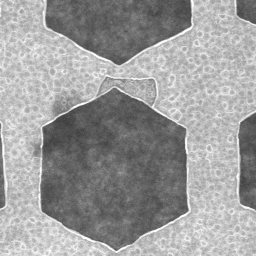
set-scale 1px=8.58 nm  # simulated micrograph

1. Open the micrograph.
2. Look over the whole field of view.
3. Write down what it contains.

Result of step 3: holes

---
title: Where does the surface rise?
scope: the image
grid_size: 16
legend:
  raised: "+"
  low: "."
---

+++.........+++.
+++.........++++
++++......++++++
++++++..++++++++
++++++++++++++++
++++++++++++++++
+++++....+++++++
+++........++++.
+++.........+++.
+++.........+++.
+++.........+++.
+++.........+++.
++..........+++.
+++........+++++
+++++....+++++++
+++++++.++++++++